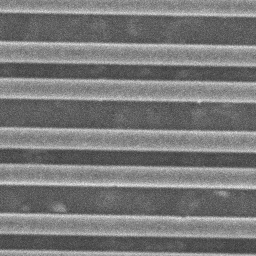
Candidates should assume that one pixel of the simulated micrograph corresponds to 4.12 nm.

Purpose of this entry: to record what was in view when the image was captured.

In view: parallel lines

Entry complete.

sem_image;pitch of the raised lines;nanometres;177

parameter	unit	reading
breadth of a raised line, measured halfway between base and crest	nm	79.9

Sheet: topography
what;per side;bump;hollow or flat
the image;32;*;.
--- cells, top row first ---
********************************
...*****************************
................................
................................
................................
************....................
********************************
********************************
................................
................................
********************************
********************************
............*....***************
................................
................................
................................
***************************.....
********************************
...*****************************
................................
................................
********************************
********************************
................................
................................
................................
................................
********************************
********************************
........................********
................................
*******.........................